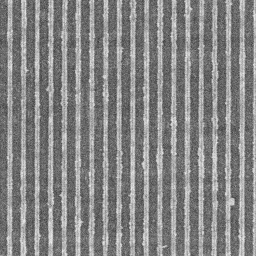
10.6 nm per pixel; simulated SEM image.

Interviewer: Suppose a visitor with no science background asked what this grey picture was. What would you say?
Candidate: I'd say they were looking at parallel lines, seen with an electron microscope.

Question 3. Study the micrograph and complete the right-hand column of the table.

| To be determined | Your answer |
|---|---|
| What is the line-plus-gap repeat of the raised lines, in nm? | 145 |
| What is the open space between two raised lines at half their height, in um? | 0.0982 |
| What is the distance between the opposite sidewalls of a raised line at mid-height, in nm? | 39.8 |